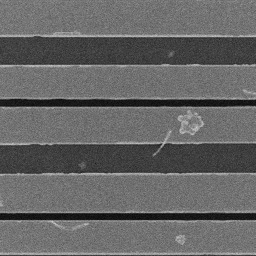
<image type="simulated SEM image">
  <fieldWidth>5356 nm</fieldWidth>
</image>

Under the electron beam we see lines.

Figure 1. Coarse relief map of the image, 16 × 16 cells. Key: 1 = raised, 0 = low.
1111111111111111
1111111111111111
0000000000000000
0000000000000000
1111111111111111
1111111111111111
0111111111111111
1111111111111111
1111111111111111
0000000000000000
0000000000000000
1111111111111111
1111111111111111
1111111111111111
1111111111111111
1111111111111111